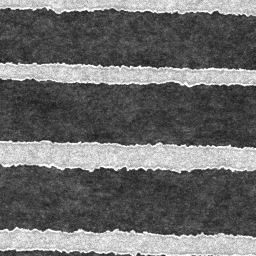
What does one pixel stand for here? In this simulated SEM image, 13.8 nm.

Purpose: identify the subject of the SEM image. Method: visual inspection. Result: one or a few lines or trenches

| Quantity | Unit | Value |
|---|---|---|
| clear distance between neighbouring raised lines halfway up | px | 61.4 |